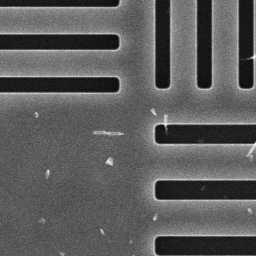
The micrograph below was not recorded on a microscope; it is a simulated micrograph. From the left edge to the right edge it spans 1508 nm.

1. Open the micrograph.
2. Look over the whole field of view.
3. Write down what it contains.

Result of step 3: groups of lines, slits or small figures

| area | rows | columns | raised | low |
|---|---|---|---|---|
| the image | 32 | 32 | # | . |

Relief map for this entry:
...............####..####..###..
###################..####..###..
###################..####..###..
###################..####..###..
...............####..####..###..
...............####..####..###..
###################..####..###..
###################..####..###..
###################..####..###..
###################..####..###..
...............####..####.####..
..............##################
################################
################################
################################
#####################...........
###################.............
###################.............
################################
################################
################################
################################
################################
###################.............
###################.............
################################
################################
################################
################################
####################............
###################.............
###################.............